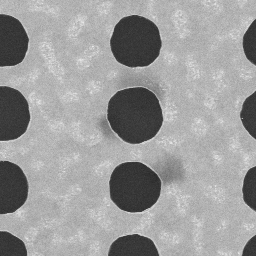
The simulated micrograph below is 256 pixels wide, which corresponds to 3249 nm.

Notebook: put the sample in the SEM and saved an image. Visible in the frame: holes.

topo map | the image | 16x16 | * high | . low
****************
.******...******
..*****...*****.
..*****...*****.
****************
.*******.*******
..*****...*****.
..*****...*****.
.******...******
****************
.******..*******
..*****...*****.
..*****...*****.
****************
****************
..*****...*****.